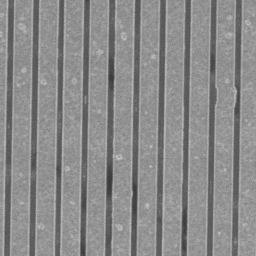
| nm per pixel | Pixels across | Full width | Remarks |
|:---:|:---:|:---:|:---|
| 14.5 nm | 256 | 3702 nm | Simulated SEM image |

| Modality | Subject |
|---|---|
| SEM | parallel lines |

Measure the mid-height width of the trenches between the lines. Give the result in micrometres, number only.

0.0994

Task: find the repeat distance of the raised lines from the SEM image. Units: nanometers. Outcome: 366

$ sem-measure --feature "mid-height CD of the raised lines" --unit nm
262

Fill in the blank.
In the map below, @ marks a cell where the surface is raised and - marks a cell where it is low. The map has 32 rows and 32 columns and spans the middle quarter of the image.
@@@@---@@@@--@@@@--@@@@@--@@@@--
@@@@---@@@@--@@@@--@@@@@--@@@@--
@@@@---@@@@--@@@@--@@@@@--@@@@--
@@@@---@@@@--@@@@--@@@@@--@@@@--
@@@@---@@@@--@@@@--@@@@@--@@@@--
@@@@---@@@@--@@@@--@@@@@-@@@@@--
@@@@---@@@@--@@@@--@@@@@-@@@@@--
@@@@--@@@@@--@@@@--@@@@--@@@@@--
@@@@--@@@@@--@@@@--@@@@--@@@@@--
@@@@--@@@@@--@@@@--@@@@--@@@@@--
@@@@--@@@@@--@@@@--@@@@--@@@@@--
@@@@--@@@@---@@@@--@@@@--@@@@@--
@@@@--@@@@---@@@@--@@@@--@@@@@--
@@@@--@@@@---@@@@--@@@@--@@@@@--
@@@@--@@@@---@@@@--@@@@--@@@@@--
@@@@--@@@@---@@@@--@@@@--@@@@@--
@@@@--@@@@---@@@@--@@@@--@@@@@--
@@@@--@@@@---@@@@--@@@@--@@@@@--
@@@@--@@@@---@@@@--@@@@--@@@@@--
@@@@--@@@@---@@@@--@@@@--@@@@@--
@@@@--@@@@---@@@@--@@@@--@@@@@-@
@@@@--@@@@---@@@@--@@@@--@@@@@-@
@@@@--@@@@--@@@@@--@@@@--@@@@--@
@@@@--@@@@--@@@@@--@@@@--@@@@--@
@@@@--@@@@--@@@@@--@@@@--@@@@--@
@@@@--@@@@--@@@@@--@@@@--@@@@--@
@@@@--@@@@--@@@@@--@@@@--@@@@--@
@@@@--@@@@--@@@@@--@@@@--@@@@--@
@@@@--@@@@--@@@@@--@@@@--@@@@--@
@@@@--@@@@--@@@@@--@@@@--@@@@--@
@@@@--@@@@--@@@@@--@@@@--@@@@--@
@@@@--@@@@--@@@@@--@@@@--@@@@--@